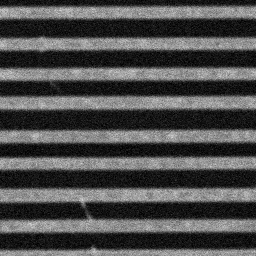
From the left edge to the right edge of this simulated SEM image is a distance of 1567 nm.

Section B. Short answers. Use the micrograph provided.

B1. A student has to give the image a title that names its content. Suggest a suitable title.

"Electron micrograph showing parallel lines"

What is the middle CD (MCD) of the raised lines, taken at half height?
70.4 nm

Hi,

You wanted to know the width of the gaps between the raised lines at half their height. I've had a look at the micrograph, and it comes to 117 nanometres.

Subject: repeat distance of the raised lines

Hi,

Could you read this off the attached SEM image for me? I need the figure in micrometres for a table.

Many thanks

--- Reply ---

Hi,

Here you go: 0.186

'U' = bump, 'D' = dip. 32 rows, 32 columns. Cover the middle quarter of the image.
DDDDDDDDDDDDDDDDDDDDDDDDDDDDDDDD
UUUUUUUUUUUUUUUUUUUUUUUUUUUUUUUU
UUUUUUUUUUUUUUUUUUUUUUUUUUUUUUUU
UUUUUUUUUUUUUUUUUUUUUUUUUUUUUUUU
DDDDDDDDDDDDDDDDDDDDDDDDDDDDDDDD
DDDDDDDDDDDDDDDDDDDDDDDDDDDDDDDD
DDDDDDDDDDDDDDDDDDDDDDDDDDDDDDDD
DDDDDDDDDDDDDDDDDDDDDDDDDDDDDDDD
UUUUUUUUUUUUUUUUUUUUUUUUUUUUUUUU
UUUUUUUUUUUUUUUUUUUUUUUUUUUUUUUU
UUUUUUUUUUUUUUUUUUUUUUUUUUUUUUUU
DDDDDDDDDDDDDDDDDDDDDDDDDDDDDDDD
DDDDDDDDDDDDDDDDDDDDDDDDDDDDDDDD
DDDDDDDDDDDDDDDDDDDDDDDDDDDDDDDD
DDDDDDDDDDDDDDDDDDDDDDDDDDDDDDDD
DDDDDDDDDDDDDDDDDDDDDDDDDDDDDDDD
DDDDDDDDDDDDDDDDDDDDDDDDDDDDDDDD
UUUUUUUUUUUUUUUUUUUUUUUUUUUUUUUU
UUUUUUUUUUUUUUUUUUUUUUUUUUUUUUUU
UUUUDDDDDDDDDDDDDDDDDDDDDDDDDDDD
DDDDDDDDDDDDDDDDDDDDDDDDDDDDDDDD
DDDDDDDDDDDDDDDDDDDDDDDDDDDDDDDD
DDDDDDDDDDDDDDDDDDDDDDDDDDDDDDDD
DDDDDDDDDDDDDDDDDDDDDDDDDDDDDDUU
UUUUUUUUUUUUUUUUUUUUUUUUUUUUUUUU
UUUUUUUUUUUUUUUUUUUUUUUUUUUUUUUU
DDDDDDDDDDDDDDDDDDDDDDDDDDDDDDDD
DDDDDDDDDDDDDDDDDDDDDDDDDDDDDDDD
DDDDDDDDDDDDDDDDDDDDDDDDDDDDDDDD
DDDDDDDDDDDDDDDDDDDDDDDDDDDDDDDD
DDDDDDDDDDDDDDDDDDDDDDDDDDDDDDDD
UUUUUUUUUUUUUUUUUUUUUUUUUUUUUUUU